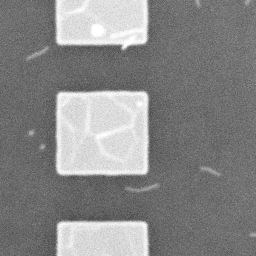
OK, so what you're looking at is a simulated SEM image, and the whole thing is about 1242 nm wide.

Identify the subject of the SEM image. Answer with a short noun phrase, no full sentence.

wiring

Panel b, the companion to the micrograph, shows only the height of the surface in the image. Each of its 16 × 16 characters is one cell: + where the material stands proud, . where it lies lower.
....+++++.......
....+++++.......
....+++++.......
................
................
................
....+++++.......
....+++++.......
....+++++.......
....+++++.......
....+++++.......
................
................
................
....+++++.......
....+++++.......